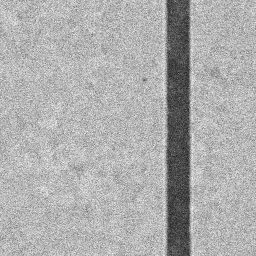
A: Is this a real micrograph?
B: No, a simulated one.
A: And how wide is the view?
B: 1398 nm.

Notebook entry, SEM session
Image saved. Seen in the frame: one or a few lines or trenches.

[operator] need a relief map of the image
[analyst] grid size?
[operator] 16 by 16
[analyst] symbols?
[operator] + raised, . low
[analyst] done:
++++++++++..++++
++++++++++..++++
++++++++++..++++
++++++++++..++++
++++++++++..++++
++++++++++..++++
++++++++++..++++
++++++++++..++++
++++++++++..++++
++++++++++..++++
++++++++++..++++
++++++++++..++++
++++++++++..++++
++++++++++..++++
++++++++++..++++
++++++++++..++++